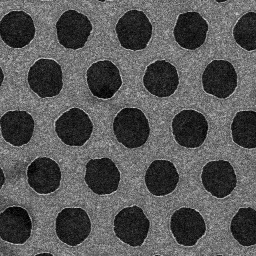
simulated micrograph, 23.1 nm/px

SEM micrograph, a regular array of holes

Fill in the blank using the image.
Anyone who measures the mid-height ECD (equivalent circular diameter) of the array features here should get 868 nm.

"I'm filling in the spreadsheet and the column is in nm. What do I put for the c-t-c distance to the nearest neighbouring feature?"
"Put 1290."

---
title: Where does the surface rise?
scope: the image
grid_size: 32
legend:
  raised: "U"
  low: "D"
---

UUUUUUUUUUUUUUUUUUUUUUUUUUUUUUUU
UDDUUUUUDDUUUUUUDDUUUUUUUUUUUUUD
DDDDUUUDDDDUUUUDDDDUUUDDDDUUUUDD
DDDDUUUDDDDUUUDDDDDUUUDDDDUUUDDD
DDDDUUUDDDDUUUUDDDDUUUDDDDUUUDDD
UDDUUUUUDDDUUUUDDDUUUUDDDUUUUUDD
UUUUUUUUUUUUUUUUUUUUUUUUUUUUUUUU
UUUUUDDUUUUUUUUUUUUUUUUUUUUDUUUU
UUUUDDDDUUUDDDDUUUDDDDUUUUDDDUUU
UUUDDDDDUUUDDDDUUUDDDDUUUDDDDDUU
UUUUDDDDUUUDDDDUUUDDDDUUUDDDDDUU
UUUUDDDUUUUDDDDUUUUDDDUUUUDDDUUU
UUUUUUUUUUUUUUUUUUUUUUUUUUUUUUUU
UUUUUUUUUUUUUUUUDUUUUUUUUUUUUUUU
DDDDUUUUDDDUUUUDDDUUUUDDDDUUUDDD
DDDDUUUDDDDDUUDDDDDUUUDDDDUUUDDD
DDDDUUUDDDDDUUDDDDDUUUDDDDUUUDDD
UDDDUUUUDDDUUUUDDDUUUUDDDDUUUDDD
UUUUUUUUUUUUUUUUDUUUUUUUUUUUUUUD
UUUUUUUUUUUUUUUUUUUUUUUUUUUUUUUU
UUUUDDDUUUUDDDUUUUUDDDUUUUDDDUUU
UUUDDDDDUUUDDDDUUUDDDDUUUDDDDUUU
DUUDDDDDUUUDDDDUUUDDDDUUUDDDDDUU
UUUUDDDUUUUDDDDUUUDDDDUUUUDDDUUU
UUUUUUUUUUUUUUUUUUUUUUUUUUUDUUUU
UUUUUUUUUUUUUUUUUUUUUUUUUUUUUUUU
DDDUUUUUDDDUUUUDDDUUUUDDDUUUUUDD
DDDDUUUDDDDUUUDDDDDUUDDDDDUUUDDD
DDDDUUUDDDDUUUDDDDDUUDDDDDUUUDDD
DDDDUUUDDDDUUUUDDDUUUUDDDUUUUDDD
UUDUUUUUDDUUUUUUDDUUUUDDUUUUUUDD
UUUUUUUUUUUUUUUUUUUUUUUUUUUUUUUU